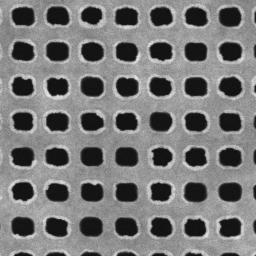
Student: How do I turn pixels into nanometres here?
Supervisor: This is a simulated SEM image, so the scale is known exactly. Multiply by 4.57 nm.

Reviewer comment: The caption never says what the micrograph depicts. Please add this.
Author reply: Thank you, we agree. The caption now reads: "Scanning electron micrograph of a regular array of holes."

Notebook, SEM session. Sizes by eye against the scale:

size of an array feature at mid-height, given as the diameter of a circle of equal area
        94.1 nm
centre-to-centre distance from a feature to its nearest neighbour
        157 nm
